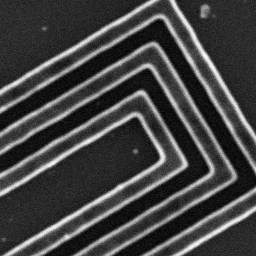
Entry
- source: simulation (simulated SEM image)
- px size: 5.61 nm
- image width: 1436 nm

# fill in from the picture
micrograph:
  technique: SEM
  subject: groups of lines, slits or small figures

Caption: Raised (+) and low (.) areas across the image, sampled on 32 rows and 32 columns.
..................++++..........
.................+++++..........
...............++++..++.........
.............+++++...+++........
............++++......++........
..........++++........+++.......
........++++.....+++...++.......
.......++++....++++++...++......
.....++++.....++++.+++..+++.....
...++++.....++++....++...++.....
..++++....+++++.....+++..+++....
++++.....++++........++...++....
++.....++++.....+++..+++...++...
+....++++.....+++++...++...+++..
....++++....++++++++...++...++..
..++++.....++++...++...+++..+++.
++++.....++++......++...++...++.
+++....++++........+++..+++...++
+.....++++..........++...++...++
....++++............+++...++...+
..+++++.............+++...+++..+
.++++.............++++....+++...
+++..............++++....++++...
+..............++++.....++++....
.............++++.....++++.....+
...........+++++....++++.....+++
..........++++....+++++....++++.
........++++.....++++....+++++..
......+++++....++++.....++++....
.....++++....+++++....++++......
...++++.....++++.....++++.......
.+++++....++++.....++++.........